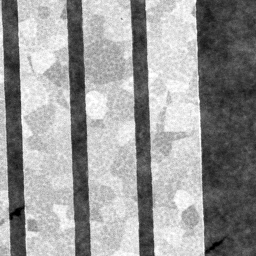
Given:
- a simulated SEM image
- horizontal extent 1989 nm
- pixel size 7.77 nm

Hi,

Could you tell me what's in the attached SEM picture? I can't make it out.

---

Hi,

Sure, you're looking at one or a few lines or trenches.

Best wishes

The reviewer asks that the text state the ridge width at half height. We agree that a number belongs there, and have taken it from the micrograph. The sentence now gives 377 nm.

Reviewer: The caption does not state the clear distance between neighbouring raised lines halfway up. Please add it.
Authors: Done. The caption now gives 125 nm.